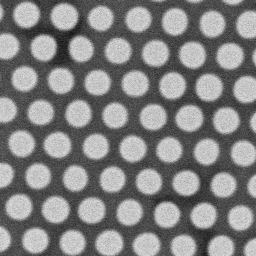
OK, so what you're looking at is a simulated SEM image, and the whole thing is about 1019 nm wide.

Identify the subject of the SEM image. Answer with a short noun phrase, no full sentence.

an array of small figures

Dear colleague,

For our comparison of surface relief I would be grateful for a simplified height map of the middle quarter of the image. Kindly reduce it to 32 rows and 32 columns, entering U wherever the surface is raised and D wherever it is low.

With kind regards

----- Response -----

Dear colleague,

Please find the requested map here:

DDDDDDDDDDDDDDDDDDDDDDDDDDDDDDDU
DDDDDDDDDDDDDDDDDDDDDDDDDDDDDDDD
UUDDDDUUUUDDDDDDUUUUDDDDDDUUDDDD
UUDDDDUUUUUDDDDUUUUUUDDDDUUUUUDD
UUDDDUUUUUUDDDDUUUUUUDDDUUUUUUDD
UUDDDUUUUUUDDDDUUUUUUDDDUUUUUUDD
UDDDDDUUUUUDDDDUUUUUUDDDUUUUUUDD
DDDDDDDUUDDDDDDDUUUUDDDDDUUUUDDD
DDDDDDDDDDDDDDDDDDDDDDDDDDUUDDDD
DDUUUDDDDDDDDDDDDDDDDDDDDDDDDDDD
DUUUUUDDDDDUUUUDDDDDDUUUDDDDDDDD
DUUUUUUDDDUUUUUDDDDDUUUUUDDDDUUU
DUUUUUUDDDUUUUUUDDDUUUUUUDDDUUUU
DUUUUUDDDDUUUUUUDDDUUUUUUDDDUUUU
DUUUUUDDDDUUUUUDDDDUUUUUUDDDUUUU
DDDUDDDDDDDUUUDDDDDDUUUUDDDDDUUU
DDDDDDDDDDDDDDDDDDDDDDDDDDDDDDUU
DDDDDDDDDDDDDDDDDDDDDDDDDDDDDDDD
UDDDDDUUUUDDDDDDUUUDDDDDDDDDDDDD
UDDDDUUUUUUDDDDUUUUUDDDDUUUUUDDD
UDDDDUUUUUUDDDUUUUUUDDDUUUUUUDDD
UDDDDUUUUUUDDDUUUUUUDDDUUUUUUDDD
UDDDDUUUUUDDDDUUUUUUDDDUUUUUUDDD
DDDDDDDUUDDDDDDUUUUDDDDDUUUUUDDD
DDDDDDDDDDDDDDDDDDDDDDDDDDDDDDDD
DDDDDDDDDDDDDDDDDDDDDDDDDDDDDDDD
DUUUUDDDDDUUUUDDDDDDUDDDDDDDDDDD
UUUUUDDDDDUUUUUDDDDUUUUDDDDDUUUU
UUUUUUDDDUUUUUUDDDUUUUUUDDDDUUUU
UUUUUUDDDUUUUUUDDDUUUUUUDDDUUUUU
DUUUUDDDDUUUUUUDDDUUUUUUDDDUUUUU
DDUDDDDDDDUUUUDDDDDUUUUDDDDDUUUU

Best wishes